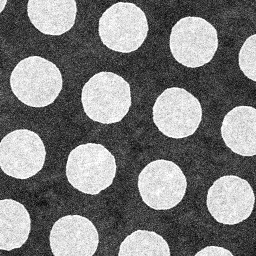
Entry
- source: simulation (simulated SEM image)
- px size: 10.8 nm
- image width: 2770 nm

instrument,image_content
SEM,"a regular array of raised bodies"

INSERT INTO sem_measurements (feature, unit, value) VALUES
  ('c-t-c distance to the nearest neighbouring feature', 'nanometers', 776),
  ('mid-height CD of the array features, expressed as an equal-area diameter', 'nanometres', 530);